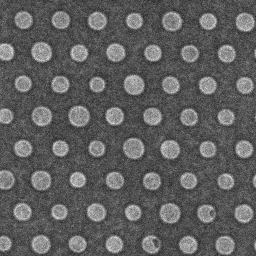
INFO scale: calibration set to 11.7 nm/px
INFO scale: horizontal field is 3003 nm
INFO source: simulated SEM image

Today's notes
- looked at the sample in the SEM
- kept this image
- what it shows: a regular array of raised bodies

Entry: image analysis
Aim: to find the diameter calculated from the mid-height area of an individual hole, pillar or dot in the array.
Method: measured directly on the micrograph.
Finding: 196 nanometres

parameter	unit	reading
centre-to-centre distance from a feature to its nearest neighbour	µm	0.427